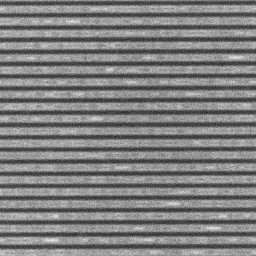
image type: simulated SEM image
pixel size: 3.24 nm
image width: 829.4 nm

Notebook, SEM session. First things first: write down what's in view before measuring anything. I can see parallel lines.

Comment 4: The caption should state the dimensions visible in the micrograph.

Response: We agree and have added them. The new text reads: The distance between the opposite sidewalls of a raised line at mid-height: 6.76 px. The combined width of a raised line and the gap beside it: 12.2 pixels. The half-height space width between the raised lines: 16.6 nm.